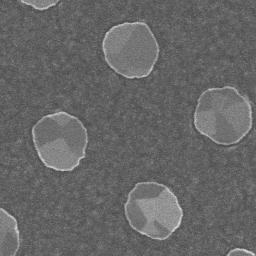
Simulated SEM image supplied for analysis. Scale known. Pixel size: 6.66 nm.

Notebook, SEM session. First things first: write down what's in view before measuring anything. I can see raised bodies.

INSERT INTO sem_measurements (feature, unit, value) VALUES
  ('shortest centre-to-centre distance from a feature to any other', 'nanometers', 762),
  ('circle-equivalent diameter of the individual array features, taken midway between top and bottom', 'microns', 0.371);